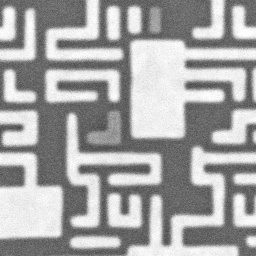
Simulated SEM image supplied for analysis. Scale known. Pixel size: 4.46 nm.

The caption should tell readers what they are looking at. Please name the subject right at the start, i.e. wiring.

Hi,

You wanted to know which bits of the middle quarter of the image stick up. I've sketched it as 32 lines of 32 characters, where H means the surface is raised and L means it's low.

LLLLLLLLLLLLLLLLLHHHHHHHHHHHHHLL
LLLLLLLLLLLLLLLLLHHHHHHHHHHHHHHL
HHHHHHHHHHHHHHLLLHHHHHHHHHHHHHHH
HHHHHHHHHHHHHHLLLHHHHHHHHHHHHHHH
LLLLLLLLLLLHHHLLLHHHHHHHHHHHHHLL
LLLLLLLLLLLHHHLLLHHHHHHHHHHHHHLL
LLLLLLLLLLLHHHLLLHHHHHHHHHHHHHLL
HHHHHHHHLLLHHHLLLHHHHHHHHHHHHHHH
HHHHHHHHLLLHHHLLLHHHHHHHHHHHHHHH
LLLLLLLLLLLLLLLLLHHHHHHHHHHHHHLL
LLLLLLLLLLLLLLLLLHHHHHHHHHHHHHLL
LLLLLLLLLLLLLLLLLHHHHHHHHHHHHHLL
LLLLLLLLLLLHHHLLLHHHHHHHHHHHHHLL
LHHLLLLLLLLHHHLLLHHHHHHHHHHHHHLL
LHHLLLLLLLLHHHLLLHHHHHHHHHHHHHLL
LHHLLLLLLLLHHHLLLHHHHHHHHHHHHHLL
LHHLLLLLLLLHHHLLLHHHHHHHHHHHHHLL
LHHLLLHHHHHHHHLLLHHHHHHHHHHHHHLL
LHHLLLHHHHHHHHLLLLLLLLLLLLLLLLLL
LHHLLLHHHHHHHHLLLLLLLLLLLLLLLLLL
LHHLLLLLLLLLLLLLLLLLLLLLLLLLLLLL
LHHLLLLLLLLLLLLLLLLLLLLLLLLLLLLL
LHHHLLLLLLLLLLLLLLLLLLLLLLLLLLLL
LHHHHHHHHHHHHHHHHHHHHHHHLLLLLLLL
LHHHHHHHHHHHHHHHHHHHHHHHLLLLLLLL
LHHLLLLLLLLLLLLLLLLLLLHHLLLLLLLL
LHHLLLLLLLLLLLLLLLLLLLHHLLLLLLLL
LHHHLLLLLLLLLLLLLLLLLLHHLLLLLLLL
LHHHHHHHLLLHHHHHHHHHHHHHLLLLLLLL
LLHHHHHHLLLHHHHHHHHHHHHHLLLLLLLL
LLLLLLHHHLLLLLLLLLLLLLLLLLLLLLLL
LLLLLLHHHLLLLLLLLLLLLLLLLLLLLLLL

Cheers